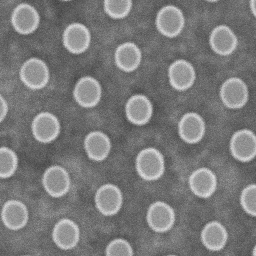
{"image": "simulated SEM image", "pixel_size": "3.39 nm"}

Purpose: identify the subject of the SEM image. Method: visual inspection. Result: a regular array of raised bodies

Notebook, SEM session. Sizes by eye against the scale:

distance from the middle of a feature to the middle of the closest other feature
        183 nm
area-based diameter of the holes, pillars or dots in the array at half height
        88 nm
